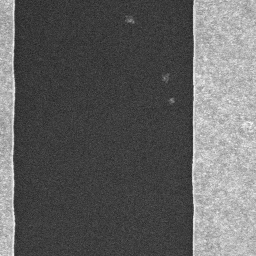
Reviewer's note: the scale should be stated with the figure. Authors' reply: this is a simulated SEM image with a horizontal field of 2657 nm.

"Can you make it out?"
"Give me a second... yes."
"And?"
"wiring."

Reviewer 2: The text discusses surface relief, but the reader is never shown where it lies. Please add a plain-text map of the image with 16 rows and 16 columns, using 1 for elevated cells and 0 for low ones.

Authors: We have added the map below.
1000000000001111
1000000000001111
1000000000001111
1000000000001111
1000000000001111
1000000000001111
1000000000001111
1000000000001111
1000000000001111
1000000000001111
1000000000001111
1000000000001111
1000000000001111
1000000000001111
1000000000001111
1000000000001111